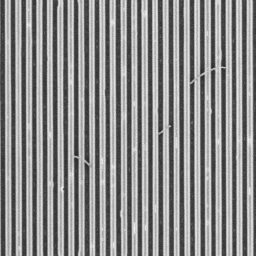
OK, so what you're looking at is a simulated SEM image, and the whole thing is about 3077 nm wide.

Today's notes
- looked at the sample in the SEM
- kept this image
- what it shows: parallel lines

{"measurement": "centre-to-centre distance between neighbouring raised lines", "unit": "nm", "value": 126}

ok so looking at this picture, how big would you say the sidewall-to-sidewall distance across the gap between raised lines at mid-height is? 70.6 nm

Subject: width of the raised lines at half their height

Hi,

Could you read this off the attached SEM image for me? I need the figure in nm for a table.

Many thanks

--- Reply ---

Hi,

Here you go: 60.1